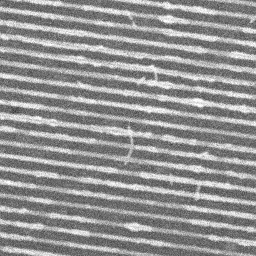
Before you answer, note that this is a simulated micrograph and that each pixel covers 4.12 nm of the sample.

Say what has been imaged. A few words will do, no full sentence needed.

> parallel lines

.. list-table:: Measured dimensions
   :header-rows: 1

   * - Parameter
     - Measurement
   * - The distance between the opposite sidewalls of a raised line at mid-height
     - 15.8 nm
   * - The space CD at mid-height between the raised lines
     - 38.2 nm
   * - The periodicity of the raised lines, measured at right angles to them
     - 13.1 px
